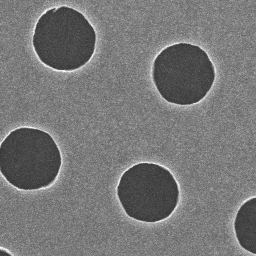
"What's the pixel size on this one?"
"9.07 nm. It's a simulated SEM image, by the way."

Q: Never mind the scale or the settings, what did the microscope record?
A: holes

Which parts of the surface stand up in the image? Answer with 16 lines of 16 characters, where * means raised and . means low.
****************
**....**********
**....**********
**....****...***
**********...***
**********...***
***********.****
****************
*..*************
....************
....****..******
*..****....*****
*******....*****
********..*****.
***************.
***************.